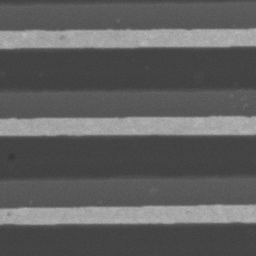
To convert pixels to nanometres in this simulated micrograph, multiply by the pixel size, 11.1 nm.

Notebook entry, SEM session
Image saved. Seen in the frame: lines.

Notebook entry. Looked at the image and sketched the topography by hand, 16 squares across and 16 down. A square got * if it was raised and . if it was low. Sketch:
****************
****************
****************
................
................
................
****************
****************
................
................
................
****************
****************
****************
................
................